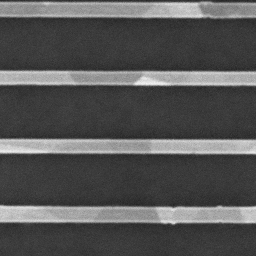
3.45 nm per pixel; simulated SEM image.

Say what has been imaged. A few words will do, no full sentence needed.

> one or a few lines or trenches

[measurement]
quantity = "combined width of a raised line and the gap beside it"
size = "0.236 µm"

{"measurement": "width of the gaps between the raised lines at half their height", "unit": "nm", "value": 190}